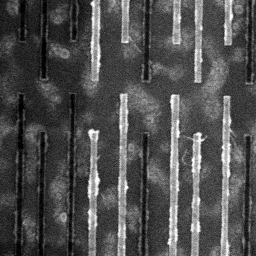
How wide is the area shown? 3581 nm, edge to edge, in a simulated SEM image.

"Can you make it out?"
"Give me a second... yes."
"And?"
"parallel lines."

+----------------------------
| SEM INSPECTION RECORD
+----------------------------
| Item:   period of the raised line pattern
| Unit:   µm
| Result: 0.354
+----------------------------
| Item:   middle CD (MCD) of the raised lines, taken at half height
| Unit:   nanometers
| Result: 90.9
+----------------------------